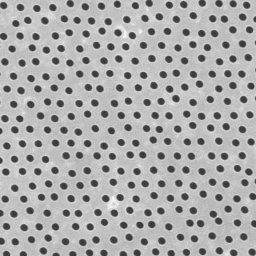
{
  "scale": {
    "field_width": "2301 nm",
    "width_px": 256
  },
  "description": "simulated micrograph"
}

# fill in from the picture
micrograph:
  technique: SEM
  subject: a regular array of holes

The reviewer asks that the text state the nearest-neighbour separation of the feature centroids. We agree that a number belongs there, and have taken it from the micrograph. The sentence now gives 124 nanometres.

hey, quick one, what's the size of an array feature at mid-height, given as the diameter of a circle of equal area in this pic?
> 62.5 nm